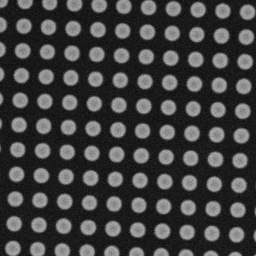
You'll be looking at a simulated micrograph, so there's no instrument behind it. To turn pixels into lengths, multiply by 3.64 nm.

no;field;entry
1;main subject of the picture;an array of small figures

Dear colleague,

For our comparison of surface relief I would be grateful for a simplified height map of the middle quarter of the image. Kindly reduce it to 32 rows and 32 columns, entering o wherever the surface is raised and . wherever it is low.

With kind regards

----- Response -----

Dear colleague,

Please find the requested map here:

................................
................................
ooo....oo....oo.................
ooo...oooo..oooo...ooo...ooo...o
ooo...oooo..oooo...ooo...ooo...o
.......oo....oo....ooo...ooo...o
...............................o
................................
ooo....oo....o..................
ooo...ooo...ooo...ooo....oo.....
ooo...ooo...ooo...oooo..oooo...o
.......oo...ooo...oooo..oooo...o
.........................oo....o
................................
oo.....o........................
ooo...ooo...ooo...ooo....oo.....
ooo..oooo...ooo...ooo...oooo..oo
oo....oo....ooo...ooo...oooo..oo
.........................oo...oo
................................
oo..............................
ooo..ooo....ooo...oo............
ooo..oooo..oooo...ooo...ooo...oo
oo....oo...oooo...ooo...ooo...oo
..................oo....ooo...oo
................................
o...............................
oo...ooo....oo....oo............
oo...ooo...oooo..oooo...ooo...oo
oo...ooo...oooo..oooo..oooo...oo
............o.....oo....ooo...oo
...............................o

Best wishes